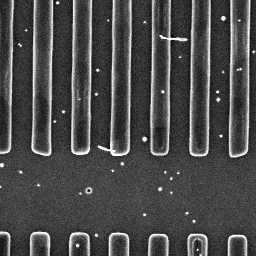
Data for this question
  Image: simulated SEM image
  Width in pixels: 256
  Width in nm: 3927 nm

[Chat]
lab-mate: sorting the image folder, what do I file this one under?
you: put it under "wiring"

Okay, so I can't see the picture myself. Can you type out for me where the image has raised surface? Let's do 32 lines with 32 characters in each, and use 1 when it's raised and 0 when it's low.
11001110011000110001100011000110
11001110011000110001100011000110
11001110011000110001100011000110
11001110011000110001100011000110
11001110011000110001100011000110
11001110011000110001100011000110
11001110011000110001100011000110
10001100011000110001100011000110
10001100011000110001100011000110
10001100011000110001100011000110
10001100011000110001100011000110
10001100011000110001100011000110
10001100011000110001100011000110
10001100011000110001100011000110
10001100011000110001100011000110
10001100011000110001100011000110
10001100011000110001100011000110
10001100011000110001100011000110
10001100011000110001100011000110
00000000000000000000000000000100
00000000000000000000000000000000
00000000000000000000000000000000
00000000000000000000000000000000
00000000000000000000000000000000
00000000000000000000000000000000
00000000000000000000000000000000
00000000000000000000000000000000
00000000000000000000000000000000
00000000000000000000000000000000
10001100011000110001100011000100
10001100011000110001100011000110
10001100011000110001100011001110